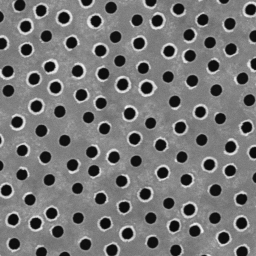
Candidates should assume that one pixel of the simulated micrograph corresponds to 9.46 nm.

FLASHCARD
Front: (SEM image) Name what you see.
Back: a regular array of holes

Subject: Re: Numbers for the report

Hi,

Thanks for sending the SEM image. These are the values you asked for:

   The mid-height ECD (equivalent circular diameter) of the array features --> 108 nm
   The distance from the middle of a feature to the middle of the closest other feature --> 211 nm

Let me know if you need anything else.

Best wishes